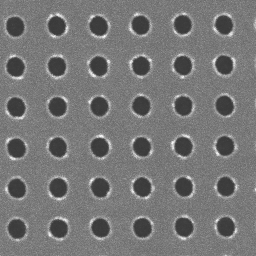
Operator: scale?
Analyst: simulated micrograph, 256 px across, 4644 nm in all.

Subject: a regular array of holes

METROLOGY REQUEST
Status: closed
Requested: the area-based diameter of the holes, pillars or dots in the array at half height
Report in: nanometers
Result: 354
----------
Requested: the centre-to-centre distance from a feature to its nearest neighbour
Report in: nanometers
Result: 731